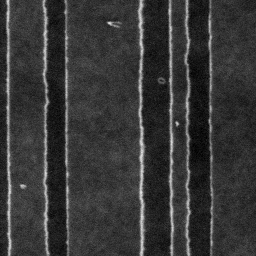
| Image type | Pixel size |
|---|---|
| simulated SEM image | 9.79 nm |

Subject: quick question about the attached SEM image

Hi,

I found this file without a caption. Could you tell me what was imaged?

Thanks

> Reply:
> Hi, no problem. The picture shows lines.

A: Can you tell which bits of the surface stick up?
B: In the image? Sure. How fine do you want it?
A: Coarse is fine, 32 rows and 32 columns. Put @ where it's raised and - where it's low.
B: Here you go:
-@@@@---@@@@@@@@@@---@@---@@@@@@
-@@@@@--@@@@@@@@@----@@---@@@@@@
-@@@@@--@@@@@@@@@----@@---@@@@@@
-@@@@@--@@@@@@@@@@---@@---@@@@@@
-@@@@@--@@@@@@@@@@---@@@--@@@@@@
-@@@@@--@@@@@@@@@@---@@@--@@@@@@
-@@@@@--@@@@@@@@@@---@@---@@@@@@
-@@@@@--@@@@@@@@@@---@@---@@@@@@
-@@@@@--@@@@@@@@@@---@@---@@@@@@
-@@@@---@@@@@@@@@----@@@--@@@@@@
-@@@@@--@@@@@@@@@----@@@--@@@@@@
-@@@@@--@@@@@@@@@----@@@--@@@@@@
-@@@@@--@@@@@@@@@@---@@---@@@@@@
-@@@@@--@@@@@@@@@----@@---@@@@@@
-@@@@@--@@@@@@@@@----@@---@@@@@@
-@@@@@--@@@@@@@@@@---@@---@@@@@@
-@@@@@--@@@@@@@@@@---@@---@@@@@@
-@@@@@--@@@@@@@@@@---@@@--@@@@@@
-@@@@@--@@@@@@@@@@---@@@--@@@@@@
-@@@@@--@@@@@@@@@@---@@@--@@@@@@
-@@@@@--@@@@@@@@@@---@@---@@@@@@
-@@@@@--@@@@@@@@@@---@@@--@@@@@@
-@@@@@--@@@@@@@@@@---@@@--@@@@@@
-@@@@@--@@@@@@@@@@---@@---@@@@@@
-@@@@@--@@@@@@@@@@---@@@---@@@@@
-@@@@@--@@@@@@@@@@---@@@---@@@@@
-@@@@@--@@@@@@@@@@---@@@--@@@@@@
-@@@@@--@@@@@@@@@@----@@--@@@@@@
-@@@@@--@@@@@@@@@@----@---@@@@@@
-@@@@@--@@@@@@@@@@----@---@@@@@@
-@@@@@--@@@@@@@@@@----@@--@@@@@@
-@@@@@--@@@@@@@@@@---@@@--@@@@@@